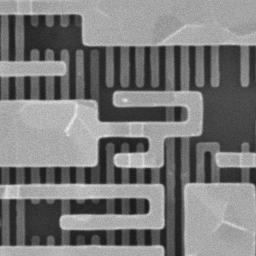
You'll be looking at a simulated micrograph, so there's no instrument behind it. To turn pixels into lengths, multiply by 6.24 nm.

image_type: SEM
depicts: wiring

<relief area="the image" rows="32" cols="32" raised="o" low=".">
oooooooooooooooooooooooooooooooo
oooooooooooooooooooooooooooooooo
..........oooooooooooooooooooooo
..........oooooooooooooooooooooo
..........oooooooooooooooooooooo
...........ooooooooooooooooooooo
................................
................................
oooooooo........................
oo..............................
................................
...............oooooooooo.......
..............ooooooooooo.......
oooooooooooo...........oo.......
oooooooooooo...........oo.......
ooooooooooooooooooooooooo.......
ooooooooooooooooooooooooo.......
oooooooooooo......ooo...........
oooooooooooo.......o............
oooooooooooo..oooooo.......ooooo
oooooooooooo..oooooo.......ooooo
................................
................................
oooooooooooooooooooo...ooooooooo
ooooooooooooooooooooo..ooooooooo
...................oo..ooooooooo
..................oo...ooooooooo
........ooooooooooooo..ooooooooo
........oooooooooooo...ooooooooo
.......................ooooooooo
.......................ooooooooo
ooooooooooooooooooooo..ooooooooo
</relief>